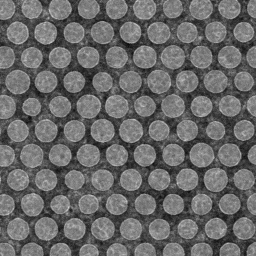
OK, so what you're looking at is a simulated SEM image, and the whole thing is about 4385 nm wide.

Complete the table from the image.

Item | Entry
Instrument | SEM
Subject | a regular array of raised bodies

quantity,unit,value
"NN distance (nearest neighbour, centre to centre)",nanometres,480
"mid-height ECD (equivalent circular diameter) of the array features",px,21.5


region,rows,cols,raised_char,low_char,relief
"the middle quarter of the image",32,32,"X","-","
X----XXX----XXX---XXXX---XXXX---
--------------------------------
-XXX----XXX----XXX----XXXX---XXX
XXXXX--XXXXX--XXXXX--XXXXX--XXXX
XXXXX--XXXXX--XXXXX--XXXXXX-XXXX
XXXXX--XXXXX--XXXXX--XXXXX--XXXX
-XXX----XXX----XXX----XXXX---XXX
--------------------------------
X---XXXX---XXXX----XXX---XXXX---
X---XXXXX--XXXXX--XXXX---XXXXX--
XX-XXXXXX--XXXXX--XXXXX-XXXXXX--
XX--XXXXX--XXXXX--XXXXX--XXXXX--
X---XXXX---XXXX----XXX---XXXX---
------X-------------------------
-XXX----XXX----XXXX---XXX----XXX
XXXXX--XXXXX--XXXXX---XXXX--XXXX
XXXXX--XXXXX--XXXXXX-XXXXX--XXXX
XXXXX--XXXXX--XXXXXX-XXXXX--XXXX
-XXXX--XXXXX--XXXXX---XXX----XXX
----------------XX--------------
-----XX-----XX-----XXX----XXX---
X---XXXXX--XXXX---XXXXX--XXXXX--
XX-XXXXXX--XXXXX--XXXXX--XXXXX--
XX-XXXXXX--XXXXX--XXXXX--XXXXX--
X---XXXX---XXXX---XXXX---XXXX---
------X-------------X-----------
----------------XX-----XX-----XX
-XXX----XXXX---XXXX---XXXX---XXX
XXXXX--XXXXX--XXXXX--XXXXX--XXXX
XXXXX--XXXXX--XXXXX--XXXXX--XXXX
-XXX---XXXXX---XXXX---XXXX---XXX
---------XX-------------------X-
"